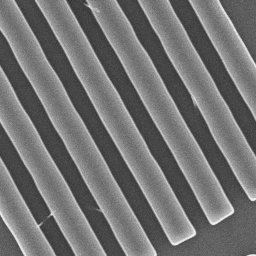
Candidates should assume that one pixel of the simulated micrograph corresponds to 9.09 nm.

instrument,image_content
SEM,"groups of lines, slits or small figures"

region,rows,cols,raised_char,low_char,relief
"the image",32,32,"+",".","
++...+++...++++...+++...++++....
+++..++++...+++...++++..++++....
+++...++++..++++...+++...++++...
++++..++++...+++...++++...+++...
.+++...++++..++++...+++...++++..
.++++...+++...++++..++++...+++..
..+++...++++..++++...++++..++++.
..++++...+++...++++..++++...++++
...+++...++++...+++...++++..++++
+..++++...+++...++++...+++...+++
+...++++..++++...+++...++++..+++
++...+++...++++..++++...+++...++
++...++++..++++...++++..++++...+
+++...+++...++++..++++...++++..+
+++...++++..++++...++++..++++...
++++...++++..++++..++++...++++..
.++++..++++...+++...++++..++++..
.++++...++++..++++...+++...++++.
..++++..++++...+++...++++..++++.
...+++...++++..++++...++++..++++
...++++..++++...++++..++++...+++
+...+++...++++..++++...++++..+++
++..++++...+++...++++..++++...++
++...++++..++++...+++...++++..++
+++..++++...+++...++++..++++...+
+++...++++..++++...+++...++++...
++++..++++...++++..++++...+++...
.+++...++++..++++...++++..++....
.++++...+++...++++..++++........
..++++..++++..++++...+++........
..++++...+++...++++.............
...++++..++++...+++.............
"